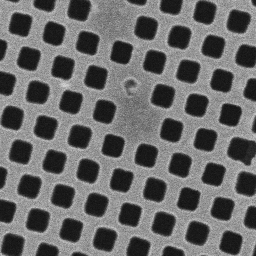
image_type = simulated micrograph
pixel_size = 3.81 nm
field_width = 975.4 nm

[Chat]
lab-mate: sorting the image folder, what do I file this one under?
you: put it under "a regular array of holes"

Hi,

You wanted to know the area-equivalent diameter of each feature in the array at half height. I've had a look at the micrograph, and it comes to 22.8 pixels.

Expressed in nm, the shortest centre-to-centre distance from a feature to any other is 132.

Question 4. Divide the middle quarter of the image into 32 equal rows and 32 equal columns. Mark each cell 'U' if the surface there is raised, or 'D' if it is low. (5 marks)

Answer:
DDDUUUUDUUUUUUUUUUUUDDDDDUUUUDDD
DDUUUUDDDDDUUUUUUUUUDDDDDUUUUDDD
DDUUUUDDDDDUUUUUUUUUUUUDUUUUDDDD
DUUUUDDDDDDUUUUUUUUUUUUUUUUUDDDD
UUUUUDDDDDUUUUUUUUUUUUUUUUUUUUUD
UUUUUUDDDDUUUUUUUUUUUUUDDDUUUUUU
UUUUUUUUUUUUUUUUUUUUUUUDDDDDUUUU
DDDDUUUUUUUUUUUUUUUUUUDDDDDDUUUU
DDDDDUUUUUUUUUUUUUUUUUDDDDDUUUUD
DDDDDUUUDDDDUUUUUUUUUUDDDDDUUUUD
DDDDUUUUDDDDDUUUUUUUUUUUDDDUUUUD
DDDDUUUUDDDDDUUUUUUUUUUUUUUUUUDD
UUDUUUUDDDDDDUUUUUUUUUUUUUUUUUUD
UUUUUUUDDDDDUUUUUUUUUUUUUUUUUUUU
UUUUUUUUUUDDUUUUUUUUUUUUUDDDDUUU
UUDDUUUUUUUUUUUUUUUUUUUUUDDDDDUU
UUDDDDDUUUUUUUUUUUUUUUUUDDDDDDUU
UUDDDDDUUUUUUUUUUUUUUUUUDDDDDUUU
UDDDDDDUUUDDDDDUUUUUUUUUDDDDDUUU
UDDDDDUUUUDDDDDUUUUUUUUUUUUUUUUU
UUDDDDUUUUDDDDDUUUUDDDUUUUUUUUUU
UUUUUUUUUDDDDDDUUUDDDDDUUUUUUUUU
UUUUUUUUUUDDDDUUUUDDDDDUUUUUDUUU
DUUUUUUUUUUUUUUUUUDDDDDUUUUDDDDD
UUUUDDDDUUUUUUUUUUDDDDDUUUUDDDDD
UUUUDDDDDUUUUUUUUUUUDDUUUUDDDDDD
UUUUDDDDDUUUUDDUUUUUUUUUUUDDDDDU
UUUDDDDDUUUUDDDDDUUUUUUUUUUDDDDU
UUUUDDDDUUUUDDDDDUUUUUUUUUUUUUUU
UUUUUDDDUUUUDDDDDUUUUDDDDUUUUUUU
DUUUUUUUUUUUDDDDDUUUDDDDDDUUUUUU
DDDUUUUUUUUUUDDDUUUUDDDDDUUUUDDD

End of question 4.